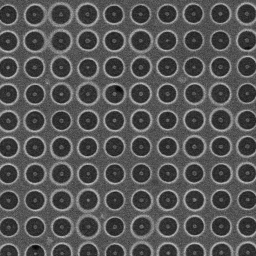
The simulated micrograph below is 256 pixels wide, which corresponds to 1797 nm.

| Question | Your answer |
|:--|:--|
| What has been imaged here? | an array of small figures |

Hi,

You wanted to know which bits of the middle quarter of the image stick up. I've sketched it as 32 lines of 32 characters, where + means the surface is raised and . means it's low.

..++....++.....++.....+.....++..
..++....++.....++.....++....++..
.+++....+++...+++....+++....+++.
++++++++++++++++++++++++++++++++
++++++++++++++++++++++++++++++++
.+++....+++...+++....+++...++++.
..++....++.....++....+++....++..
..+......+.....+......+.....++..
..++....++.....++....+++....++..
.+++....+++...++++...++++..++++.
++++++++++++++++++++++++++++++++
++++++++++++++++++++++++++++++++
.+++....+++....++....+++....++..
..++....++.....++.....++....++..
..++.....+.....++.....++....++..
.+++....+++....++....+++....+++.
+++++..+++++..++++..++++++++++++
++++++++++++++++++++++++++++++++
+++++..+++++..++++..+++++..++++.
.+++....+++....++....+++....++..
..++....++.....++.....+.....++..
..++....++.....++.....++....++..
.+++....+++...++++...+++....+++.
++++++++++++++++++++++++++++++++
++++++++++++++++++++++++++++++++
.++++..++++...++++...++++..++++.
..++....+++....++.....++....++..
..+.....++.....++.....++....++..
..++....+++....++....+++....++..
.++++..++++...++++..+++++..++++.
++++++++++++++++++++++++++++++++
+++++.++++++++++++++++++++++++++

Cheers